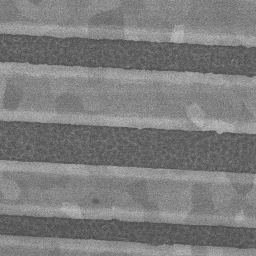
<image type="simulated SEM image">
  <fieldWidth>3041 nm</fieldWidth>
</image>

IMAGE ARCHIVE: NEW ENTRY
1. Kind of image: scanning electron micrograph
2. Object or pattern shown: one or a few lines or trenches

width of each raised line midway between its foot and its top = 546 nm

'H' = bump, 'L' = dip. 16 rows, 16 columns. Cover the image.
HHHHHHHHHHHHHHHH
HHHHHHHHHHHHHHHH
LLLLLLLLLLLLLLHH
LLLLLLLLLLLLLLLL
HHHHHHLLLLLLLLLL
HHHHHHHHHHHHHHHH
HHHHHHHHHHHHHHHH
LLLLLHHHHHHHHHHH
LLLLLLLLLLLLLLLL
LLLLLLLLLLLLLLLL
HHHLLLLLLLLLLLLL
HHHHHHHHHHHHHHHH
HHHHHHHHHHHHHHHH
LLLLLLLLHHHHHHHH
LLLLLLLLLLLLLLLL
HHHHHHHHHLLLLLLL